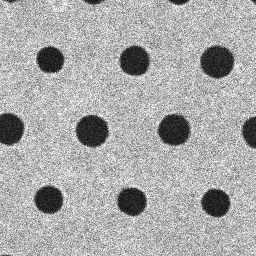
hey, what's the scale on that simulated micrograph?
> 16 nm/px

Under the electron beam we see a regular array of holes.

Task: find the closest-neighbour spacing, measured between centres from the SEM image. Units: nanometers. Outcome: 1300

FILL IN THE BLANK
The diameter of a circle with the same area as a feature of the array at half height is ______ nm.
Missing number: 491